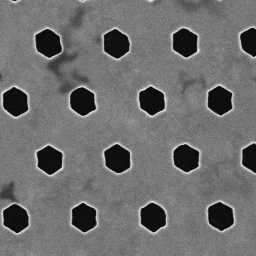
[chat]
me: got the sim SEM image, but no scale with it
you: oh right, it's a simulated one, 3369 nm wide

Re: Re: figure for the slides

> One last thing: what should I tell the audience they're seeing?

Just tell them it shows a regular array of holes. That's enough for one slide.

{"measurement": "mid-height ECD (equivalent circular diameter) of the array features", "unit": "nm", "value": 348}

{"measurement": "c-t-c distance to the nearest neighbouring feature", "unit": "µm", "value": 0.882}